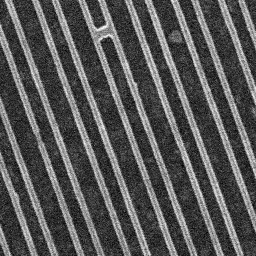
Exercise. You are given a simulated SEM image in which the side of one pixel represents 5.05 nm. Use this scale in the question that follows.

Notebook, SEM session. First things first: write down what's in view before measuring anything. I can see parallel lines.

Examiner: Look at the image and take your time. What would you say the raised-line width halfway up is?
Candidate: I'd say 0.0273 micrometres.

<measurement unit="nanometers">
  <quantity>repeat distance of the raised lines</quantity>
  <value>110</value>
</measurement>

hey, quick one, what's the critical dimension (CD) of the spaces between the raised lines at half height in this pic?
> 72.5 nm